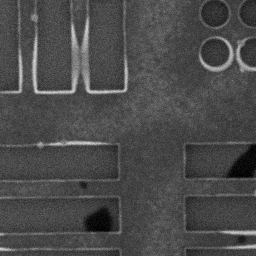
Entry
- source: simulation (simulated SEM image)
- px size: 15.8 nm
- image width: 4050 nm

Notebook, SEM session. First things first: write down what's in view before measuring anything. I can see groups of lines, slits or small figures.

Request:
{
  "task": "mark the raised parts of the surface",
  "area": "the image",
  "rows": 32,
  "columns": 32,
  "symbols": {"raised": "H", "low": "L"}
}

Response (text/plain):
LLHHLLLLLHHLLLLLHHHHHHHHHHLLHHLL
LLHHHLLLLHHLLLLLHHHHHHHHHLLLLHLL
LLHHHLLLLHHLLLLLHHHHHHHHHLLLHHLL
LLHHHLLLLHHLLLLLHHHHHHHHHHHHHHHH
LLHHHLLLLHHLLLLLHHHHHHHHHHHHHHHH
LLHHLLLLLHHLLLLLHHHHHHHHHLLLHHLL
LLLHLLLLLHHLLLLLHHHHHHHHHLLLLHLL
LLLHLLLLLLHLLLLLHHHHHHHHHLLLLHLL
LLLHLLLLLLHLLLLLHHHHHHHHHHLLHHHL
LLLHLLLLLHHLLLLLHHHHHHHHHHHHHHHH
LLLHLLLLLHHLLLLLHHHHHHHHHHHHHHHH
LLHHHLLLLHHHLLHHHHHHHHHHHHHHHHHH
HHHHHHHHHHHHHHHHHHHHHHHHHHHHHHHH
HHHHHHHHHHHHHHHHHHHHHHHHHHHHHHHH
HHHHHHHHHHHHHHHHHHHHHHHHHHHHHHHH
HHHHHHHHHHHHHHHHHHHHHHHHHHHHHHHH
HHHHHHHHHHHHHHHHHHHHHHHHHHHHHHHH
HHHHHHHHHHHHHHHHHHHHHHHHHHHHHHHH
LLLLLLLLLLLLLLLHHHHHHHHLLLLLLLLL
LLLLLLLLLLLLLLLHHHHHHHHLLLLLLLLL
LLLLLLLLLLLLLLLHHHHHHHHLLLLLLLLL
LLLLLLLLLLLLLLLHHHHHHHHLLLLLLLLL
LLLLLLLLLLLLLLHHHHHHHHHHHHHHHHHH
HHHHHHHHHHHHHHHHHHHHHHHHHHHHHHHH
HHHHHHHHHHHHHHHHHHHHHHHLLLLLLLLL
LLLLLLLLLLLLLLLHHHHHHHHLLLLLLLLL
LLLLLLLLLLLLLLLHHHHHHHHLLLLLLLLL
LLLLLLLLLLLLLLLHHHHHHHHLLLLLLLLL
LLLLLLLLLLLLLLLHHHHHHHHLLLLLLLLL
HHHHHHHHHHHHHHHHHHHHHHHHHHHHHHHH
HHHHHHHHHHHHHHHHHHHHHHHHHHHHHHHH
LLLLLLLLLLLLLLLHHHHHHHHLLLLLLLLL